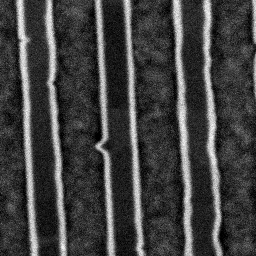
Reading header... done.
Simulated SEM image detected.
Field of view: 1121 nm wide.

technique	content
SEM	one or a few lines or trenches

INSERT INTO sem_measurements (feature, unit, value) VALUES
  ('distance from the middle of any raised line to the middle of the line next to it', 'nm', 341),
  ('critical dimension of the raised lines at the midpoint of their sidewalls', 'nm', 126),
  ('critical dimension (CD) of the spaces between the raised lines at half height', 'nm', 213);